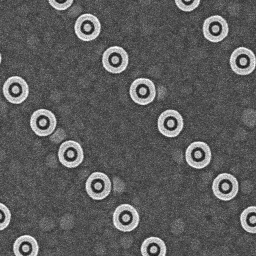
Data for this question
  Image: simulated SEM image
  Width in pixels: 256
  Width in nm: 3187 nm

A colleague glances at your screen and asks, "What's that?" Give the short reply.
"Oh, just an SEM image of a regular array of ring-shaped raised bodies with a dot in the middle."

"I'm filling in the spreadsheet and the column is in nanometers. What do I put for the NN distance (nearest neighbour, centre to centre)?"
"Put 524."